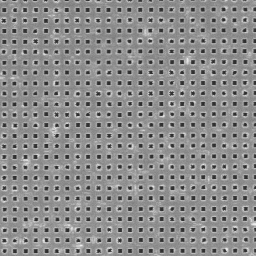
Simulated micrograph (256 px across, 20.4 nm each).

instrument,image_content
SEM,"a regular array of holes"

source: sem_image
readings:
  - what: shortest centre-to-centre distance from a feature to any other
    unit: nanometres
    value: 206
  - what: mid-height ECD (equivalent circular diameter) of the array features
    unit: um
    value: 0.0893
